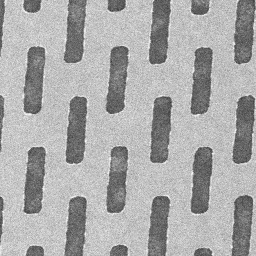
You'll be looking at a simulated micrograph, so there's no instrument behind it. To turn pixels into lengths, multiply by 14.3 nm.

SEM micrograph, a regular array of holes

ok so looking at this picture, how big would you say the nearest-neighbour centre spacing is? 926 nm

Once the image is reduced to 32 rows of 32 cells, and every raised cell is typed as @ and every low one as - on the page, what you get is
-@@--@@@---@@---@@@--@@@--@@@@--
-@@--@@@---@@@-@@@@--@@@--@@@---
-@@@@@@@---@@@@@@@@--@@@@@@@@---
@@@@@@@@---@@@@@@@@--@@@@@@@@---
@@@@@@@@---@@@@@@@@--@@@@@@@@---
@@@@@@@@---@@@@@@@@--@@@@@@@@---
@@@---@@---@@@--@@@--@@@---@@---
@@@---@@--@@@@--@@@--@@@---@@--@
@@@---@@@@@@@@--@@@@@@@@--@@@@@@
@@@---@@@@@@@@--@@@@@@@@--@@@@@@
@@@---@@@@@@@---@@@@@@@@--@@@@@@
@@@--@@@@@@@@---@@@@@@@@--@@@@@@
-@@--@@@@--@@---@@@--@@@--@@@@--
-@@--@@@@--@@---@@@--@@@--@@@@--
-@@@@@@@@--@@@@@@@@--@@@@@@@@---
@@@@@@@@---@@@@@@@@--@@@@@@@@---
@@@@@@@@---@@@@@@@@--@@@@@@@@---
@@@@@@@@---@@@@@@@@--@@@@@@@@---
@@@@-@@@---@@@--@@@--@@@@-@@@---
@@@---@@---@@@--@@@--@@@---@@--@
@@@---@@@-@@@@--@@@@@@@@---@@@@@
@@@---@@@@@@@@--@@@@@@@@---@@@@@
@@@---@@@@@@@@--@@@@@@@@--@@@@@@
@@@--@@@@@@@@---@@@@@@@@--@@@@@@
@@@--@@@@@@@@---@@@@-@@@--@@@@-@
@@@--@@@@--@@---@@@--@@@--@@@---
@@@--@@@---@@@-@@@@--@@@--@@@---
@@@@@@@@---@@@@@@@@--@@@@@@@@---
@@@@@@@@---@@@@@@@@--@@@@@@@@--@
@@@@@@@@---@@@@@@@@--@@@@@@@@--@
@@@@@@@@---@@@@@@@---@@@@@@@@--@
@@@---@@--@@@@--@@---@@@--@@@--@